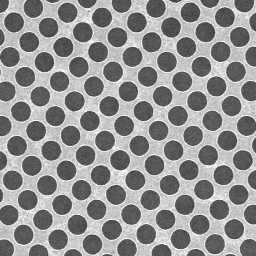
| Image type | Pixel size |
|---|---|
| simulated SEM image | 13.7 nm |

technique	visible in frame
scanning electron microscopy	a regular array of holes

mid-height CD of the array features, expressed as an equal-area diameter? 20.8 px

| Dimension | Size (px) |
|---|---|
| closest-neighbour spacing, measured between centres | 24.3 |